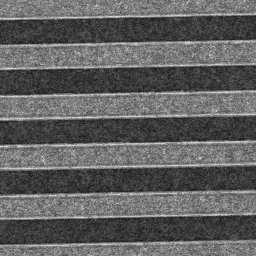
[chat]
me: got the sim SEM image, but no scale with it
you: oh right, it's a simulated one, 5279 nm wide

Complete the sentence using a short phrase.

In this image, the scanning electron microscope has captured parallel lines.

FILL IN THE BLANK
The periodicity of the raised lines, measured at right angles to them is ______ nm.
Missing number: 1030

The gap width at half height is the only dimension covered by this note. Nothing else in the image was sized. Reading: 569 nm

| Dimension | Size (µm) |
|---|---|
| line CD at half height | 0.461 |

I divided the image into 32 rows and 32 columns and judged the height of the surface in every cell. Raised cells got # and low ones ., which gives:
################################
################################
................................
................................
................................
..............#...##############
################################
################################
#...............................
................................
................................
..............................##
################################
################################
################.###............
................................
................................
................................
################################
################################
###########################.#...
................................
................................
................................
....############################
################################
################################
................................
................................
................................
.................###############
################################